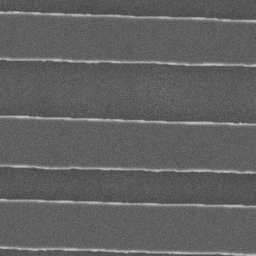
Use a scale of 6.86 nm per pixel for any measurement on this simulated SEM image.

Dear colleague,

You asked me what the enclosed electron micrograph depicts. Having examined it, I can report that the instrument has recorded lines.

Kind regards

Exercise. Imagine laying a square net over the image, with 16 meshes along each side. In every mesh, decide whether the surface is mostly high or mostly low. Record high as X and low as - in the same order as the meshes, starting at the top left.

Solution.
----------------
XXXXXXXXXXXXXXXX
XXXXXXXXXXXXXXXX
XXXXXXXXXXXXXXXX
----------------
----------------
----------------
XXXXXXXX--------
XXXXXXXXXXXXXXXX
XXXXXXXXXXXXXXXX
---XXXXXXXXXXXXX
----------------
X---------------
XXXXXXXXXXXXXXXX
XXXXXXXXXXXXXXXX
XXXXXXXXXXXXXXXX